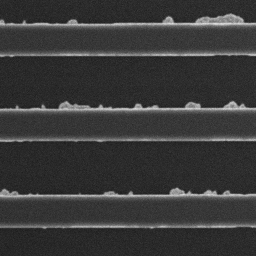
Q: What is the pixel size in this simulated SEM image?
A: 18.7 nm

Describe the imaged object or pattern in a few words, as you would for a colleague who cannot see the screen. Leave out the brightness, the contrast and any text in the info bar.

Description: lines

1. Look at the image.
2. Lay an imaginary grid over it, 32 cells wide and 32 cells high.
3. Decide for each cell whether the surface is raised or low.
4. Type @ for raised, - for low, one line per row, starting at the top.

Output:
--------------------------------
--------------------------------
--------------------------------
@@@@@@@@@@@@@@@@@@@@@@@@@@@@@@@@
@@@@@@@@@@@@@@@@@@@@@@@@@@@@@@@@
@@@@@@@@@@@@@@@@@@@@@@@@@@@@@@@@
@@@@@@@@@@@@@@@@@@@@@@@@@@@@@@@@
--------------------------------
--------------------------------
--------------------------------
--------------------------------
--------------------------------
--------------------------------
--------------------------------
@@@@@@@@@@@@@@@@@@@@@@@@@@@@@@@@
@@@@@@@@@@@@@@@@@@@@@@@@@@@@@@@@
@@@@@@@@@@@@@@@@@@@@@@@@@@@@@@@@
@@@@@@@@@@@@@@@@@@@@@@@@@@@@@@@@
--------------------------------
--------------------------------
--------------------------------
--------------------------------
--------------------------------
--------------------------------
--@@@@@@@@@@@@@@@@@@@@@@@@@@@@@@
@@@@@@@@@@@@@@@@@@@@@@@@@@@@@@@@
@@@@@@@@@@@@@@@@@@@@@@@@@@@@@@@@
@@@@@@@@@@@@@@@@@@@@@@@@@@@@@@@@
--------------------------------
--------------------------------
--------------------------------
--------------------------------